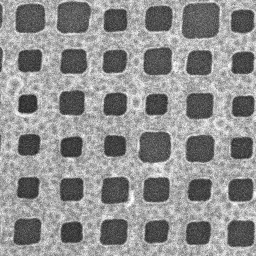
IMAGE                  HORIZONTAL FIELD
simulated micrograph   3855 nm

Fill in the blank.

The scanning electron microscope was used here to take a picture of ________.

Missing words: a regular array of holes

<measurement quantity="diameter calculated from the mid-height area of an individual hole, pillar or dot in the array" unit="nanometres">405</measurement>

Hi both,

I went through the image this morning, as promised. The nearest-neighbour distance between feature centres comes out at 0.627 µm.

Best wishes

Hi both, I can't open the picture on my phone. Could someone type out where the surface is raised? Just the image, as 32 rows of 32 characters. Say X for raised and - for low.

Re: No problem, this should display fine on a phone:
XXX--XX----XXXXXXXXXXXX----XXXXX
XX----X----XX---XX----X-----X---
XX----X----XX---XX----X----XX---
XX----X----XX---XX---XX----XX---
XXXXXXXXXXXXXXXXXXXXXXX----XXXXX
XXXXXXXXXXXXXXXXXXXXXXXXXXXXXXXX
XXX--XXX---XX---XX----XX--XXXX-X
XX---XXX---XX---XX---XX----XX---
XX---XXX---XX---XX---XX----XX---
XXXXXXXXXXXXXXXXXXXXXXXXX-XXXXXX
XXXXXXXXXXXXXXXXXXXXXXXXXXXXXXXX
XXXXXXXX--XXXX-XXXXXXXXXXXXXXXXX
XX---XX----XX---XX---XX----XX---
XX---XX----XX---XX---XX----XX---
XXXXXXXXXXXXXX-XXXXXXXX---XXX--X
XXXXXXXXXXXXXXXXXXXXXXXXXXXXXXXX
XXXXXXXXXXXXXXXXXX---XXXXXXXXXXX
XX---XXX--XXX---X----XX----XX---
XX---XXX--XXX---X----XX----XX---
XXX-XXXX--XXX--XX----XX----XX---
XXXXXXXXXXXXXXXXXXXXXXXXXXXXXXXX
XXXXXXXXXXXXXXXXXXXXXXXXXXXXXXXX
XX---XXX--XXX---XX---XXX--XXX---
XX---XX----XX---XX---XX---XX----
XX---XX---XXX---XX---XX---XX----
XXXXXXXXXXXXX--XXXXXXXXXXXXXXXXX
XXXXXXXXXXXXXXXXXXXXXXXXXXXXXXXX
XX---XXXXXXXX---XXX--XXXXXXXX--X
XX---XXX--XX----XX---XX---XX----
XX---XXX--XX----XX---XX---XX----
XX--XXXXXXXXX--XXXXXXXXX--XX----
XXXXXXXXXXXXXXXXXXXXXXXXXXXXXXXX